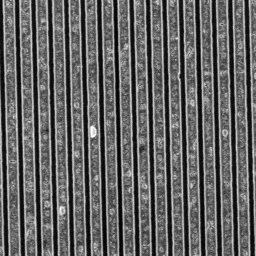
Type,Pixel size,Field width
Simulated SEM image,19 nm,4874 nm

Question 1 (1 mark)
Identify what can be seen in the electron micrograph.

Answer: parallel lines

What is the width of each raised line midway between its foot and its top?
226 nanometers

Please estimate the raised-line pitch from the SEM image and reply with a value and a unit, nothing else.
312 nm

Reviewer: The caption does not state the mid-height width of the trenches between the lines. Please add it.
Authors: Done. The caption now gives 88 nanometres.